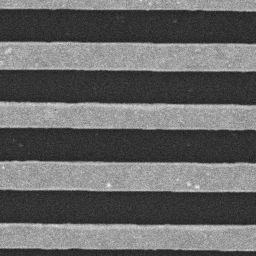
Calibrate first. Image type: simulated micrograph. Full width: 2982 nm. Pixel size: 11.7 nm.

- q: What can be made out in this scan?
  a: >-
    lines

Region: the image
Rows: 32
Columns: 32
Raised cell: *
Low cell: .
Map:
********************************
................................
................................
................................
................................
******************..............
********************************
********************************
********************************
................................
................................
................................
................................
********************************
********************************
********************************
................................
................................
................................
................................
********************************
********************************
********************************
********************************
................................
................................
................................
................................
********************************
********************************
********************************
................................